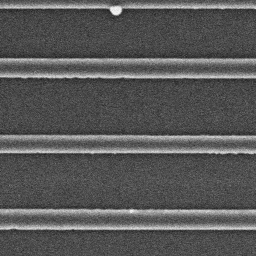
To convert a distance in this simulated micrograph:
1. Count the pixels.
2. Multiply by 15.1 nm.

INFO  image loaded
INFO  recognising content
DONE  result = lines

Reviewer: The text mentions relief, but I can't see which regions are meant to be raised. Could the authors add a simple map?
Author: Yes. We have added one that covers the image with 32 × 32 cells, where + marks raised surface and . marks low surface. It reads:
++++++++++++++++++++++++++++++++
..............+.................
................................
................................
................................
................................
................................
++++++++++++++++++++++++++++++++
++++++++++++++++++++++++++++++++
++++++++++++++++++++++++++++++++
................................
................................
................................
................................
................................
................................
................................
++++++++++++++++++++++++++++++++
++++++++++++++++++++++++++++++++
................................
................................
................................
................................
................................
................................
................................
++++++++++++++++++++++++++++++++
++++++++++++++++++++++++++++++++
++++++++++++++++++++++++++++++++
................................
................................
................................